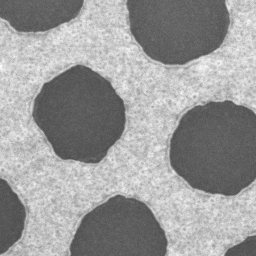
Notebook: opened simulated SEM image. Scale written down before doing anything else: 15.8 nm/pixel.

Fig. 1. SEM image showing holes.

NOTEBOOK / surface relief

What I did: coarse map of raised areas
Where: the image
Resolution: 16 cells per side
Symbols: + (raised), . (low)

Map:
.....+++......++
+...++++......++
++++++++......++
+++++++++....+++
++++..++++++++++
+++....+++++++++
++......+++++..+
++......+++.....
+++.....+++.....
+++....++++.....
+++++++++++.....
.+++++++++++....
.++++++..+++++++
..+++.....++++++
.++++.....++++++
.+++......++++..